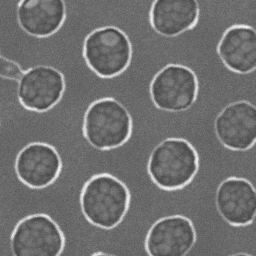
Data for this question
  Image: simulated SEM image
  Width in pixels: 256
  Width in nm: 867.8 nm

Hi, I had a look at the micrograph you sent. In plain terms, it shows holes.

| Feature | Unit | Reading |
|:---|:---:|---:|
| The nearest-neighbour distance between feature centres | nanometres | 255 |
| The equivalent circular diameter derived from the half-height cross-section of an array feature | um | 0.145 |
